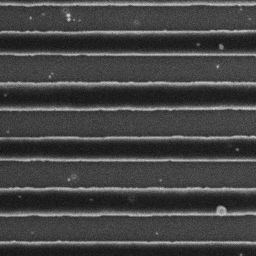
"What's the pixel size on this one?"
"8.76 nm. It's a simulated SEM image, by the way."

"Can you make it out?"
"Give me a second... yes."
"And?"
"lines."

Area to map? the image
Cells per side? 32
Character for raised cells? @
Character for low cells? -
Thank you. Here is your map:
@@@@@@@@@@@@@@@@@@@@@@@@@@@@@@@@
--------------------------------
--------------------------------
--------------------------------
@@@@@@@@@@@@@@@@@@@@@@@@@@@@@@@@
@@@@@@@@@@@@@@@@@@@@@@@@@@@@@@@@
@@@@@@@@@@@@@@@@@@@@@@@@@@@@@@@@
--------------------------------
--------------------------------
--------------------------------
@@@@@@@@@@@@@@@@@@@@@@@@@@@@@@@@
@@@@@@@@@@@@@@@@@@@@@@@@@@@@@@@@
@@@@@@@@@@@@@@@@@@@@@@@@@@@@@@@@
@@@@@@@@@@@@@@@@@@@@@@@@@@@@@@@@
--------------------------------
--------------------------------
--------------------------------
@@@@@@@@@@@@@@@@@@@@@@@@@@@@@@@@
@@@@@@@@@@@@@@@@@@@@@@@@@@@@@@@@
@@@@@@@@@@@@@@@@@@@@@@@@@@@@@@@@
--------------------------------
--------------------------------
--------------------------------
---@--@@------------------------
@@@@@@@@@@@@@@@@@@@@@@@@@@@@@@@@
@@@@@@@@@@@@@@@@@@@@@@@@@@@@@@@@
@@@@@@@@@@@@@@@@@@@@@@@@@@@@@@@@
--------------------------------
--------------------------------
--------------------------------
@@@@@@@@@@@@@@@@@@@@@@@@@@@@@@@@
@@@@@@@@@@@@@@@@@@@@@@@@@@@@@@@@